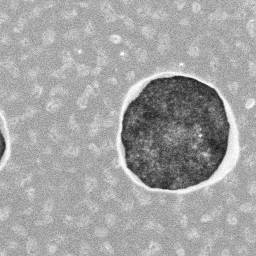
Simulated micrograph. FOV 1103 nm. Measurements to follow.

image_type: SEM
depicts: holes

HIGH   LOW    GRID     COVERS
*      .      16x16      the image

****************
****************
****************
****************
****************
*********....***
********......**
********......**
********......**
********......**
********......**
*********...****
****************
****************
****************
****************